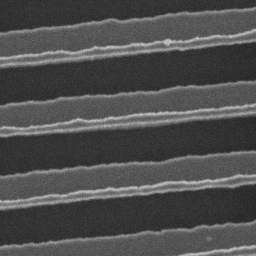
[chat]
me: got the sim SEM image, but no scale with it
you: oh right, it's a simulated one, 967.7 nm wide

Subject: lines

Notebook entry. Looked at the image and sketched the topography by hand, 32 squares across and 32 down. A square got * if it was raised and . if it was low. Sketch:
................................
.........................*******
.............**.****************
.....***************************
********************************
****************************....
******************..............
********........................
................................
................................
............................****
..................**************
.......*************************
********************************
****************************....
*****************...............
*******.........................
................................
................................
..........................******
................****************
....****************************
********************************
**************************......
****************................
******..........................
................................
................................
........................********
..............******************
...*****************************
********************************